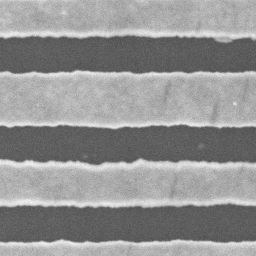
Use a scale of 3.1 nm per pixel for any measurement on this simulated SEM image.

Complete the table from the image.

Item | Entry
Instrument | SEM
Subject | lines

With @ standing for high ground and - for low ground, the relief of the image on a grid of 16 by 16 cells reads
@@@@@@@@@@@@@@@@
@@@@@@@@@@@@@@@@
----------------
----------------
----@@---------@
@@@@@@@@@@@@@@@@
@@@@@@@@@@@@@@@@
@@@@@@@@@@@@@@@@
----------------
----------------
@@@@@@@@@@@@@@@@
@@@@@@@@@@@@@@@@
@@@@@@@@@@@@@@@@
----------------
----------------
@@@@@@@@@@@@@@@@